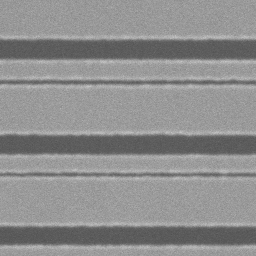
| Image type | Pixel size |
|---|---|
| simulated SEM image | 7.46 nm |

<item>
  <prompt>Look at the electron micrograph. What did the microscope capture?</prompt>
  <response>lines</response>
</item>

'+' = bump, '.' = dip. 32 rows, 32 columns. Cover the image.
++++++++++++++++++++++++++++++++
++++++++++++++++++++++++++++++++
++++++++++++++++++++++++++++++++
++++++++++++++++++++++++++++++++
++++++++++++++++++++++++++++++++
................................
................................
................................
++++++++++++++++++++++++++++++++
++++++++++++++++++++++++++++++++
++++++++++++++++++++++++++++++++
++++++++++++++++++++++++++++++++
++++++++++++++++++++++++++++++++
++++++++++++++++++++++++++++++++
++++++++++++++++++++++++++++++++
++++++++++++++++++++++++++++++++
++++++++++++++++++++++++++++++++
................................
................................
+.+.++++++..............+......+
++++++++++++++++++++++++++++++++
++++++++++++++++++++++++++++++++
++++++++++++++++++++++++++++++++
++++++++++++++++++++++++++++++++
++++++++++++++++++++++++++++++++
++++++++++++++++++++++++++++++++
++++++++++++++++++++++++++++++++
++++++++++++++++++++++++++++++++
................................
................................
................................
++++++++++++++++++++++++++++++++